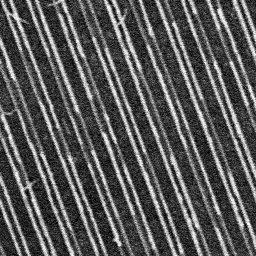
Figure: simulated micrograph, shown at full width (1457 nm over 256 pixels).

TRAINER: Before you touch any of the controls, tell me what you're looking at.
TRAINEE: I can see parallel lines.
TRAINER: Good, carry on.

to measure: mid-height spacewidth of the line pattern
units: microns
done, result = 0.0753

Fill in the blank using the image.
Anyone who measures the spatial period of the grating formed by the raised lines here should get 137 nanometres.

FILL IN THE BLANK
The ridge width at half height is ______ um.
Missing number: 0.06